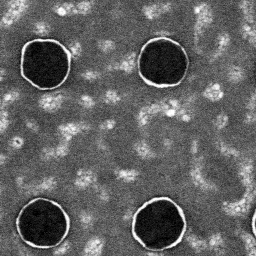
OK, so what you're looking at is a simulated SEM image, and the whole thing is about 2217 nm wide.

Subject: raised bodies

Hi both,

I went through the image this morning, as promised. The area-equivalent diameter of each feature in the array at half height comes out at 433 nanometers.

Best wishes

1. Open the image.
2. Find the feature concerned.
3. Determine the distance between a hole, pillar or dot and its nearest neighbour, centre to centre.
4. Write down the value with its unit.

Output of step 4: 1010 nm